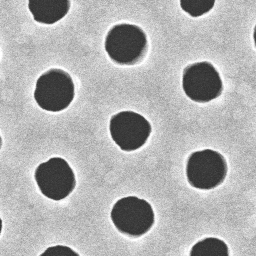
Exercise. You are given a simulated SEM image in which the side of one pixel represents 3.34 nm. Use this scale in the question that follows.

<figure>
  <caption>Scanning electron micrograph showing holes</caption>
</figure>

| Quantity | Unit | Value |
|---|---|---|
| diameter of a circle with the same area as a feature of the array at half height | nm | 138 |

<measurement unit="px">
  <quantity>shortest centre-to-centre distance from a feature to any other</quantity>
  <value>85.2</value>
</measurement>